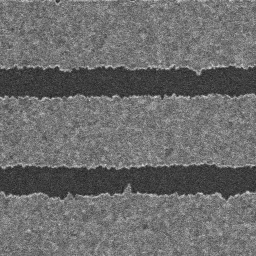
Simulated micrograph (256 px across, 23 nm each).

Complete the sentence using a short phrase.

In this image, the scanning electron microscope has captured one or a few lines or trenches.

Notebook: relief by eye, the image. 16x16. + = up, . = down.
++++++++++++++++
++++++++++++++++
++++++++++++++++
++++++++++++++++
................
................
++++++++++++++++
++++++++++++++++
++++++++++++++++
++++++++++++++++
................
................
++++++++++++++++
++++++++++++++++
++++++++++++++++
++++++++++++++++